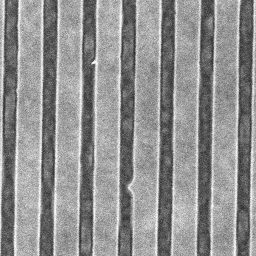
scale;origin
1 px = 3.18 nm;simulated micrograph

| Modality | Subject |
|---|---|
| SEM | parallel lines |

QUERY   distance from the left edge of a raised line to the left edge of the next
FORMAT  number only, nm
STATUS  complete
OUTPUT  125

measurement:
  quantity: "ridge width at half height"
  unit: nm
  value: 76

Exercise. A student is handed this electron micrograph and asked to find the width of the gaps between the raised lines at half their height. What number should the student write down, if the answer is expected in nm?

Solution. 46.9